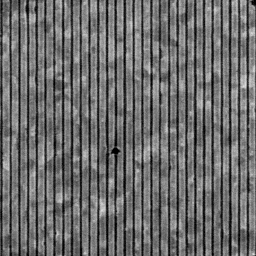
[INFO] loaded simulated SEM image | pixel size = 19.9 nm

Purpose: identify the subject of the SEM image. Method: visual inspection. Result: parallel lines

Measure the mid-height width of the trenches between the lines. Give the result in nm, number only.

57.2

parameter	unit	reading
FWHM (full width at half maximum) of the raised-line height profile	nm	114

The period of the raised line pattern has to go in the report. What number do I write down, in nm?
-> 175